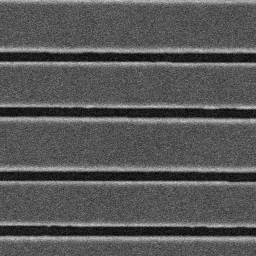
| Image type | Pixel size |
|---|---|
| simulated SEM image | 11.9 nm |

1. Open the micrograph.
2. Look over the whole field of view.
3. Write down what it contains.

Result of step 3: lines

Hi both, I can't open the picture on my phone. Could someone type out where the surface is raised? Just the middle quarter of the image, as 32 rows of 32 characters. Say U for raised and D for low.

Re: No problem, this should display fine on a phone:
UUUUUUUUUUUUUUUUUUUUUUUUUUUUUUUU
UUUUUUUUUUUUUUUUUUUUUUUUUUUUUUUU
UUUUUUUUUUUUUUUUUUUUUUUUUUUUUUUU
UUUUUUUUUUUUUUUUUUUUUUUUUUUUUUUU
UUUUUUUUUUUUUUUUUUUUUUUUUUUUUUUU
UUUUUUUUUUUUUUUUUUUUUUUUUUUUUUUU
UUUUUUUUUUUUUUUUUUUUUUUUUUUUUUUU
UUUUUUUUUUUUUUUUUUUUUUUUUUUUUUUU
UUUUUUUUUUUUUUUUUUUUUUUUUUUUUUUU
UUUUUUUUUUUUUUUUUUUUUUUUUUUUUUUU
UUUUUUUUUUUUUUUUUUUUUUUUUUUUUUUU
DDDDDDDDDDDDDDDDDDDDDDDDDDDDDDDD
DDDDDDDDDDDDDDDDDDDDDDDDDDDDDDDD
DDDDDDDDDDDDDDDDDDDDDDDDDDDDDDDD
UUUUUUUUUUUUUUUUUUUUUUUUUUUUUUUU
UUUUUUUUUUUUUUUUUUUUUUUUUUUUUUUU
UUUUUUUUUUUUUUUUUUUUUUUUUUUUUUUU
UUUUUUUUUUUUUUUUUUUUUUUUUUUUUUUU
UUUUUUUUUUUUUUUUUUUUUUUUUUUUUUUU
UUUUUUUUUUUUUUUUUUUUUUUUUUUUUUUU
UUUUUUUUUUUUUUUUUUUUUUUUUUUUUUUU
UUUUUUUUUUUUUUUUUUUUUUUUUUUUUUUU
UUUUUUUUUUUUUUUUUUUUUUUUUUUUUUUU
UUUUUUUUUUUUUUUUUUUUUUUUUUUUUUUU
UUUUUUUUUUUUUUUUUUUUUUUUUUUUUUUU
UUUUUUUUUUUUUUUUUUUUUUUUUUUUUUUU
UUUUUUUUUUUUUUUUUUUUUUUUUUUUUUUU
DDDDDDDDDDDDDDDDDDDDDDDDDDDDDDDD
DDDDDDDDDDDDDDDDDDDDDDDDDDDDDDDD
UUUUUUUUUUUUUUUUUUUUUUUUUUUUUUUU
UUUUUUUUUUUUUUUUUUUUUUUUUUUUUUUU
UUUUUUUUUUUUUUUUUUUUUUUUUUUUUUUU